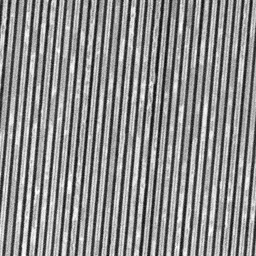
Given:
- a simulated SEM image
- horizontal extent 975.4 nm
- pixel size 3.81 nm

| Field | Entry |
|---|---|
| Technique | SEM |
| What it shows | parallel lines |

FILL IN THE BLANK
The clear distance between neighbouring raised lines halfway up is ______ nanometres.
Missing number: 14.7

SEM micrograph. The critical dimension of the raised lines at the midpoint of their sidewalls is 15.2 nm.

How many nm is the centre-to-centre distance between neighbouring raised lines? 30.5